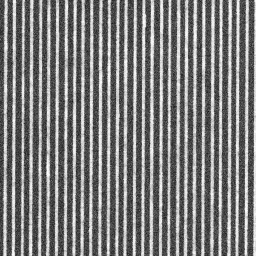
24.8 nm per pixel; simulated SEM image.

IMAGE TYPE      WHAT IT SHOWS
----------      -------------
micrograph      parallel lines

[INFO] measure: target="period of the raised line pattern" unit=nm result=214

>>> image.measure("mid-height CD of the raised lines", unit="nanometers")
58.9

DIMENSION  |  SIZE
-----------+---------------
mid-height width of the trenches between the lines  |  152 nanometres